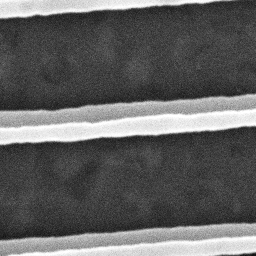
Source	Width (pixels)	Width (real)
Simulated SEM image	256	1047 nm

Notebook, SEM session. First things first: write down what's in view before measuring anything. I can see lines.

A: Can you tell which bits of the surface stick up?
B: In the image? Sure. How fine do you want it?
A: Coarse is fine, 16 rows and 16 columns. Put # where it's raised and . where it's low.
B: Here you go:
########........
................
................
................
................
................
........########
################
########........
................
................
................
................
................
........########
################